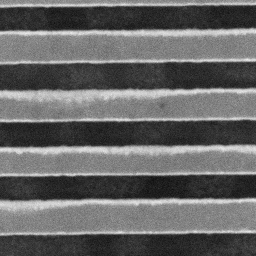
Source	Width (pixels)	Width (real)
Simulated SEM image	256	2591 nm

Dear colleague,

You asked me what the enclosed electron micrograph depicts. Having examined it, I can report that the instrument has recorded lines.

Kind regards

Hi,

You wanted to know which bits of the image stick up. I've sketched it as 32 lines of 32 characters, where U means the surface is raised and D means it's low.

UUUUUUUUUUUUUUUUUUUUUUUUUUUUUUUU
DDDDDDDDDDDDDDDDDDDDDDDDDDDDDDDD
DDDDDDDDDDDDDDDDDDDDDDDDDDDDDDDD
DDDDDDDDDDDDDDDDDDDDDDDDDDDDDDDD
UUUUUUUUUUUUUUUUUUUUUUUUUUUUUUUU
UUUUUUUUUUUUUUUUUUUUUUUUUUUUUUUU
UUUUUUUUUUUUUUUUUUUUUUUUUUUUUUUU
UUUUUUUUUUUUUUUUUUUUUUUUUUUUUUUU
DDDDDDDDDDDDDDDDDDDDDDDDDDDDDDDD
DDDDDDDDDDDDDDDDDDDDDDDDDDDDDDDD
DDDDDDDDDDDDDDDDDDDDDDDDDDDDDDDD
UUUUUUUUUUUUUUUUUUUUUUUUUUUUUUUU
UUUUUUUUUUUUUUUUUUUUUUUUUUUUUUUU
UUUUUUUUUUUUUUUUUUUUUUUUUUUUUUUU
UUUUUUUUUUUUUUUUUUUUUUUUUUUUUUUU
DDDDDDDDDDDDDDDDDDDDDDDDDDDDDDDD
DDDDDDDDDDDDDDDDDDDDDDDDDDDDDDDD
DDDDDDDDDDDDDDDDDDDDDDDDDDDDDDDD
UUDUUUUUUUUUUUUUUUUUUUUUUUUUUUUU
UUUUUUUUUUUUUUUUUUUUUUUUUUUUUUUU
UUUUUUUUUUUUUUUUUUUUUUUUUUUUUUUU
UUUUUUUUUUUUUUUUUUUUUUUUUUUUUUUU
DDDDDDDDDDDDDDDDDDDDDDDDDDDDDDDD
DDDDDDDDDDDDDDDDDDDDDDDDDDDDDDDD
DDDDDDDDDDDDDDDDDDDDDDDDDDDDDDDD
UUUUUUUUUUUUUUUUUUUUUUUUUUUUUUUU
UUUUUUUUUUUUUUUUUUUUUUUUUUUUUUUU
UUUUUUUUUUUUUUUUUUUUUUUUUUUUUUUU
UUUUUUUUUUUUUUUUUUUUUUUUUUUUUUUU
DDDDDDDDDDDDDDDDDDDDDDDDDDDDDDDD
DDDDDDDDDDDDDDDDDDDDDDDDDDDDDDDD
DDDDDDDDDDDDDDDDDDDDDDDDDDDDDDDD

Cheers